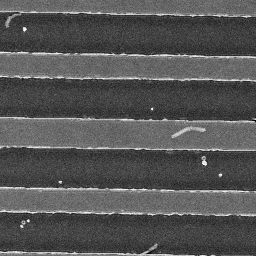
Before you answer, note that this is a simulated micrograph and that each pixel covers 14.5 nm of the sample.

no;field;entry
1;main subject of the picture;lines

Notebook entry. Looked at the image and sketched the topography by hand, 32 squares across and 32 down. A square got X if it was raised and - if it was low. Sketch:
XXXXXXXXXXXXXXXXXXXXXXXXXXXXXXXX
--XXXXXXXXXXXXXXXXXXXXXXXXXXXXXX
--------------------------------
--------------------------------
--------------------------------
--------------------------------
--------------------------------
XXXXXXXXXXXXXXXXXXXXXXXXXXXXXXXX
XXXXXXXXXXXXXXXXXXXXXXXXXXXXXXXX
XXXXXXXXXXXXXXXXXXXXXXXXXXXXXXXX
--------------------------------
--------------------------------
--------------------------------
--------------------------------
--------------------------------
XXXXXXXXXXXXXXXXXXXXXXXXXXXXXXXX
XXXXXXXXXXXXXXXXXXXXXXXXXXXXXXXX
XXXXXXXXXXXXXXXXXXXXXXXXXXXXXXXX
---------XXXXXXXXXXXXXXXXXXXXXXX
--------------------------------
--------------------------------
--------------------------------
--------------------------------
XXX-----------------------------
XXXXXXXXXXXXXXXXXXXXXXXXXXXXXXXX
XXXXXXXXXXXXXXXXXXXXXXXXXXXXXXXX
---XX-X-XXXXXXXXXXXXXXXXXXXXXXXX
--------------------------------
--------------------------------
--------------------------------
--------------------------------
--------------------------------